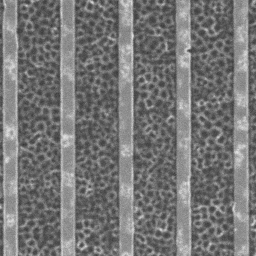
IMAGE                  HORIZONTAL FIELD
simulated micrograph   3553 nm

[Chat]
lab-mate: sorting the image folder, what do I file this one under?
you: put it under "parallel lines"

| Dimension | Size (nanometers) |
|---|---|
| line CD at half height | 187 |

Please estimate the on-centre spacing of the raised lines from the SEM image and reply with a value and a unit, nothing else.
800 nanometers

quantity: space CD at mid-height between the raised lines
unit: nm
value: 610